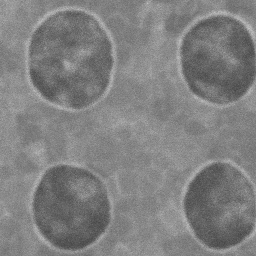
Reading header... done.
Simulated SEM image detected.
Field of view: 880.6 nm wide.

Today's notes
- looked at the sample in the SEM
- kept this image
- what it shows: holes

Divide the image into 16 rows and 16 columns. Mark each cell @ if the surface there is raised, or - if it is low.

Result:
@@@@@@@@@@@@@@@@
@@----@@@@@@---@
@@-----@@@@-----
@@-----@@@@-----
@@-----@@@@-----
@@-----@@@@@----
@@@---@@@@@@@-@@
@@@@@@@@@@@@@@@@
@@@@@@@@@@@@@@@@
@@@@@@@@@@@@@@@@
@@@--@@@@@@@@--@
@@-----@@@@@----
@@-----@@@@-----
@@-----@@@@@----
@@-----@@@@@----
@@@--@@@@@@@@--@